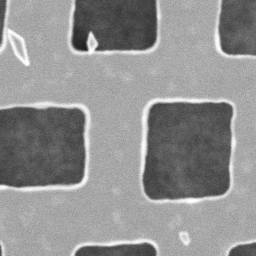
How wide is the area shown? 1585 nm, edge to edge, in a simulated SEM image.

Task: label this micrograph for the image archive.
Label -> holes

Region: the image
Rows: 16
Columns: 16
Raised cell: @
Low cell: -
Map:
@@@@@-----@@@@--
@@@@------@@@@--
@@@@------@@@@--
@@@@@@@@@@@@@@@@
@@@@@@@@@@@@@@@@
@@@@@@@@@@@@@@@@
@@@@@@@@@@----@@
-----@@@@------@
-----@@@@-----@@
-----@@@@-----@@
-----@@@@-----@@
-----@@@@-----@@
@@@@@@@@@@-@@@@@
@@@@@@@@@@@@@@@@
@@@@@@@@@@@@@@@@
@@@@@-----@@@@@-